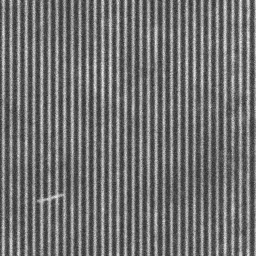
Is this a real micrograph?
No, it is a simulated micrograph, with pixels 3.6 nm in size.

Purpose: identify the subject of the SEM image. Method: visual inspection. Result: parallel lines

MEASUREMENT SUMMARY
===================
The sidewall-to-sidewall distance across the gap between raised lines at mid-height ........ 18.5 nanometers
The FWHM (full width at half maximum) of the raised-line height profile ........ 2.5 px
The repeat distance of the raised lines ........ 0.0276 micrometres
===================